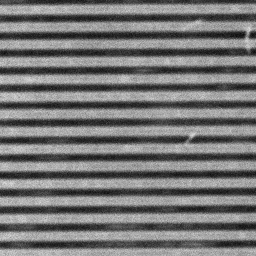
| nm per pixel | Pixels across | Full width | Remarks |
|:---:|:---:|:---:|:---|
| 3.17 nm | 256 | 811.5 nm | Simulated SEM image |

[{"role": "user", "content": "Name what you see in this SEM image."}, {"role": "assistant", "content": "parallel lines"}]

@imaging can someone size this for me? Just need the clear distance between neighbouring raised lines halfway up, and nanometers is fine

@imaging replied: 28.5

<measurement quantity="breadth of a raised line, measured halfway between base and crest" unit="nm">25.8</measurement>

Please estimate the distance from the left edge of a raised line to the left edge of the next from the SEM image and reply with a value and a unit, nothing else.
55.3 nm